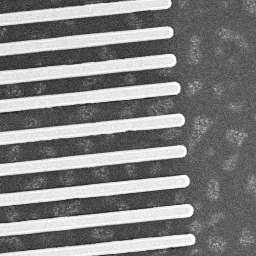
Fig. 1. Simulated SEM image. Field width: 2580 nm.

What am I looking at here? parallel lines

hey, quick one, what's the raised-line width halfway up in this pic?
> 110 nanometers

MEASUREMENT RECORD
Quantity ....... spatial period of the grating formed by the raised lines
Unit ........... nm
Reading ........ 300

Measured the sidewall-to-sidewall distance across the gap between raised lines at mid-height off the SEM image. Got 194 nm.